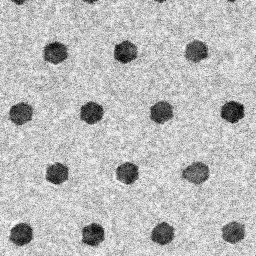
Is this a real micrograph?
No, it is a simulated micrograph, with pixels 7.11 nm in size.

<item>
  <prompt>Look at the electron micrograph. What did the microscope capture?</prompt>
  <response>a regular array of holes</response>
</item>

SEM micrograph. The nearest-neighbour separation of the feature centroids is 496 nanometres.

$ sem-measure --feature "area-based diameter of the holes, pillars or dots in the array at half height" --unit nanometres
175